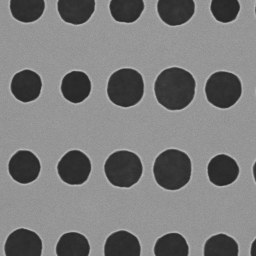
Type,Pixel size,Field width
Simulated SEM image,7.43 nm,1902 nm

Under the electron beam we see a regular array of holes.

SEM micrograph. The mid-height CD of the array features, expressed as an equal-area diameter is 262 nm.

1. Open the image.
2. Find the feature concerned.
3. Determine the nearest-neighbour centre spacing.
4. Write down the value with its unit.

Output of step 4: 0.366 micrometres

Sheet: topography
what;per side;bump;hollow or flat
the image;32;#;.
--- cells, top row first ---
#.....#.....##....##....##....##
#....##.....##....##....##....##
##...###...####..###....###..###
################################
################################
################################
################################
################################
#####################.##########
##...###...###....##....##...###
#....###...###....#.....##....##
##...###...##.....#.....##....##
##..#####.####...###....##....##
#####################..####.####
################################
################################
################################
################################
################################
##..####...###...###...####..###
#....##....##.....#.....##....##
#....##....##.....#.....##....##
##..####...###...##.....##...###
#####################..#########
################################
################################
################################
################################
################################
#....###..####...###...####..###
#....##....##....##....###....##
#....##....##.....#.....#.....#.